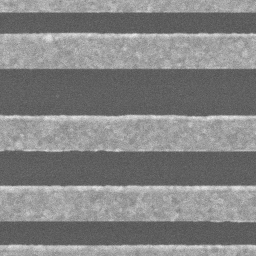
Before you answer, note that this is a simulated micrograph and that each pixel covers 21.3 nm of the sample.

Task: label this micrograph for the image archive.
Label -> lines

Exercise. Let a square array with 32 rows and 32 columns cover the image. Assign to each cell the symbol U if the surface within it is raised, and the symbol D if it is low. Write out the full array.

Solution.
UUUUUUUUUUUUUUUUUUUUUUUUUUUUUUUU
DDDDDDDDDDDDDDDDDDDDDDDDDDDDDDDD
DDDDDDDDDDDDDDDDDDDDDDDDDDDDDDDD
DDDDDDDDDDDDDDDDDDDDDDDDDDDDDDDD
DDDDDDUUUUUUUUUUUUUUUUUUUUUUUUUU
UUUUUUUUUUUUUUUUUUUUUUUUUUUUUUUU
UUUUUUUUUUUUUUUUUUUUUUUUUUUUUUUU
UUUUUUUUUUUUUUUUUUUUUUUUUUUUUUUU
DDDDDDDDDDDDDDDDDDDDDDDDDDDDDDDD
DDDDDDDDDDDDDDDDDDDDDDDDDDDDDDDD
DDDDDDDDDDDDDDDDDDDDDDDDDDDDDDDD
DDDDDDDDDDDDDDDDDDDDDDDDDDDDDDDD
DDDDDDDDDDDDDDDDDDDDDDDDDDDDDDDD
DDDDDDDDDDDDDDDDDDDDDDDDDDDDDDDD
DDDDDDDDDDDDDDDDDDDDDDDDDDDDDDDD
UUUUUUUUUUUUUUUUUUUUUUUUUUUUUUUU
UUUUUUUUUUUUUUUUUUUUUUUUUUUUUUUU
UUUUUUUUUUUUUUUUUUUUUUUUUUUUUUUU
UUUUUUUUUUUUUUUUUUUUUUUUUUUUUUUU
DDDDDDDDDDDDDDDDDDDDDDDDDDDDDDDD
DDDDDDDDDDDDDDDDDDDDDDDDDDDDDDDD
DDDDDDDDDDDDDDDDDDDDDDDDDDDDDDDD
DDDDDDDDDDDDDDDDDDDDDDDDDDDDDDDD
DDDUUUUUUUUUUUUDUUDDUUUUUUUUUUUU
UUUUUUUUUUUUUUUUUUUUUUUUUUUUUUUU
UUUUUUUUUUUUUUUUUUUUUUUUUUUUUUUU
UUUUUUUUUUUUUUUUUUUUUUUUUUUUUUUU
UUUUUUUUUUUUUUUUUUUUUUUUUUUUUUUU
DDDDDDDDDDDDDDDDDDDDDDDDDDDDDDDD
DDDDDDDDDDDDDDDDDDDDDDDDDDDDDDDD
DDDDDDDDDDDDDDDDDDDDDDDDDDDDDDDD
UUUUUUUUUUUUUUUUUUUUUUUUUUUUUUUU